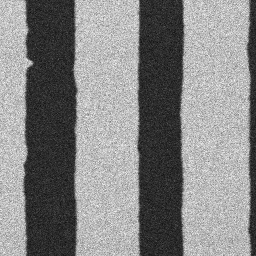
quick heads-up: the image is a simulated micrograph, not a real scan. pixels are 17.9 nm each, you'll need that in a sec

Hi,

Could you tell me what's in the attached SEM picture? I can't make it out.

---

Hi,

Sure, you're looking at one or a few lines or trenches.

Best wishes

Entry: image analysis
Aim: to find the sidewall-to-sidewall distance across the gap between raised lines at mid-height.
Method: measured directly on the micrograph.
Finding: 1130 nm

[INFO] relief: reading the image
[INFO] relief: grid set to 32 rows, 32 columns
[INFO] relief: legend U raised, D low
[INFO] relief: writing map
DDDUUUUUUDDDDDDDDUUUUUUDDDDDDDDU
DDDUUUUUUDDDDDDDDUUUUUUDDDDDDDDU
DDDUUUUUUDDDDDDDDUUUUUUDDDDDDDDU
DDDUUUUUUDDDDDDDDUUUUUUDDDDDDDDU
DDDUUUUUUDDDDDDDDUUUUUUDDDDDDDDU
DDDUUUUUUDDDDDDDDUUUUUUDDDDDDDDU
DDDUUUUUUDDDDDDDDUUUUUUDDDDDDDDU
DDDDUUUUUDDDDDDDDUUUUUUDDDDDDDDU
DDDUUUUUUDDDDDDDDUUUUUUDDDDDDDDU
DDDUUUUUUDDDDDDDDUUUUUUDDDDDDDDU
DDDUUUUUUUDDDDDDDUUUUUUDDDDDDDDU
DDDUUUUUUUDDDDDDDUUUUUUDDDDDDDDU
DDDUUUUUUUDDDDDDDUUUUUUDDDDDDDDU
DDDUUUUUUUDDDDDDDUUUUUUDDDDDDDDU
DDDUUUUUUUDDDDDDDUUUUUUDDDDDDDDU
DDDUUUUUUUDDDDDDDUUUUUUDDDDDDDDU
DDDUUUUUUDDDDDDDDUUUUUUDDDDDDDDU
DDDUUUUUUUDDDDDDDUUUUUUDDDDDDDDU
DDDUUUUUUUDDDDDDDUUUUUUDDDDDDDDU
DDDUUUUUUUDDDDDDDUUUUUUDDDDDDDDU
DDDUUUUUUDDDDDDDDUUUUUUDDDDDDDDU
DDDUUUUUUDDDDDDDDUUUUUUDDDDDDDDU
DDDUUUUUUDDDDDDDDUUUUUUDDDDDDDDU
DDDUUUUUUDDDDDDDDUUUUUUDDDDDDDDU
DDDUUUUUUUDDDDDDDUUUUUUDDDDDDDDU
DDDUUUUUUUDDDDDDDUUUUUUDDDDDDDDU
DDDUUUUUUUDDDDDDDUUUUUUDDDDDDDDU
DDDUUUUUUUDDDDDDDUUUUUUDDDDDDDDU
DDDUUUUUUUDDDDDDDUUUUUUDDDDDDDDU
DDDUUUUUUUDDDDDDDUUUUUUDDDDDDDDU
DDDUUUUUUUDDDDDDDUUUUUUDDDDDDDDU
DDDUUUUUUUDDDDDDDUUUUUUDDDDDDDDU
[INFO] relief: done